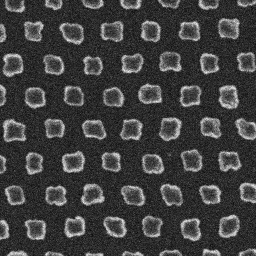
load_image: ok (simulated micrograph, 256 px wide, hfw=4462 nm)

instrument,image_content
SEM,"a regular array of raised bodies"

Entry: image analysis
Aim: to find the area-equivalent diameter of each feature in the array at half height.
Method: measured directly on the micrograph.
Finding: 0.345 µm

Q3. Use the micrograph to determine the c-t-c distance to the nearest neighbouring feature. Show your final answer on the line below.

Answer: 642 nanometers